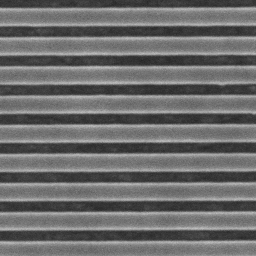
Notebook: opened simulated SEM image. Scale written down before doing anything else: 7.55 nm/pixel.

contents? parallel lines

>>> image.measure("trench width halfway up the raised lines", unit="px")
11.9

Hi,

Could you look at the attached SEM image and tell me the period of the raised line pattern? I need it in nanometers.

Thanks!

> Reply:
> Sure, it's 220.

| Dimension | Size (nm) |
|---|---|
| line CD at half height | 131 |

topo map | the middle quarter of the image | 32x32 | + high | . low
................................
++++++++++++++++++++++++++++++++
++++++++++++++++++++++++++++++++
++++++++++++++++++++++++++++++++
++++++++++++++++++++++++++++++++
................................
................................
................................
++++++++++++++++++++++++++++++++
++++++++++++++++++++++++++++++++
++++++++++++++++++++++++++++++++
++++++++++++++++++++++++++++++++
................................
................................
................................
++++++++++++++++++++++++++++++++
++++++++++++++++++++++++++++++++
++++++++++++++++++++++++++++++++
++++++++++++++++++++++++++++++++
...++.....++++++.....++++..++...
................................
................................
................................
++++++++++++++++++++++++++++++++
++++++++++++++++++++++++++++++++
++++++++++++++++++++++++++++++++
++++++++++++++++++++++++++++++++
................................
................................
................................
++++++++++++++++++++++++++++++++
++++++++++++++++++++++++++++++++